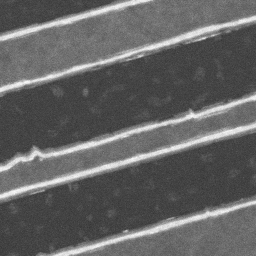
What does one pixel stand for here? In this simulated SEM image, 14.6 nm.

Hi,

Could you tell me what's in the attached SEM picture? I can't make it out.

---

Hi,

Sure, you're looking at one or a few lines or trenches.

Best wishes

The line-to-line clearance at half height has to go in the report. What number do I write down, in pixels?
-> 73.7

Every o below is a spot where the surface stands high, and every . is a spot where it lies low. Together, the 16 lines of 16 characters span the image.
.......ooooooooo
...oooooooooooo.
ooooooooooo.....
oooooooo........
oooo............
o...............
..............oo
...........ooooo
.......ooooooo..
....oooooo......
ooooooo.........
ooo.............
................
.............ooo
.........ooooooo
......oooooooooo